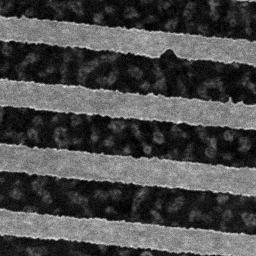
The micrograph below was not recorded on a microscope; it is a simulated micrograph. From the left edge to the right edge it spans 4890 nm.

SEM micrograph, one or a few lines or trenches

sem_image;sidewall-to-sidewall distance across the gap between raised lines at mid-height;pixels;39.7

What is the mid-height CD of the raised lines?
24.5 px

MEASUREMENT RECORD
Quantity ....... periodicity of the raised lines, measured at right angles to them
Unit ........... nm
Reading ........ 1230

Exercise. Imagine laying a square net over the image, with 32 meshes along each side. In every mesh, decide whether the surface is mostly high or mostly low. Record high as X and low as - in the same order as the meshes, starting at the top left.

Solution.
--------------------------------
--------------------------------
XXXXX---------------------------
XXXXXXXXXXXXXXX-----------------
XXXXXXXXXXXXXXXXXXXXXXXXX-------
------XXXXXXXXXXXXXXXXXXXXXXXXXX
---------------XXXXX--XXXXXXXXXX
--------------------------XXXXXX
--------------------------------
--------------------------------
XXXXX---------------------------
XXXXXXXXXXXXXXX-----------------
XXXXXXXXXXXXXXXXXXXXXXXXX-------
----XXXXXXXXXXXXXXXXXXXXXXXXXXXX
--------------XXXXXXXXXXXXXXXXXX
------------------------XXXXXXXX
--------------------------------
--------------------------------
XXXX----------------------------
XXXXXXXXXXXXXXX-----------------
XXXXXXXXXXXXXXXXXXXXXXXXX-------
---XXXXXXXXXXXXXXXXXXXXXXXXXXXXX
------------XXXXXXXXXXXXXXXXXXXX
-----------------------XXXXXXXXX
--------------------------------
--------------------------------
X-------------------------------
XXXXXXXXXXXXX-------------------
XXXXXXXXXXXXXXXXXXXXXX----------
--XXXXXXXXXXXXXXXXXXXXXXXXXXXXXX
-------------XXXXXXXXXXXXXXXXXXX
------------------X--XX-XXXXXXXX